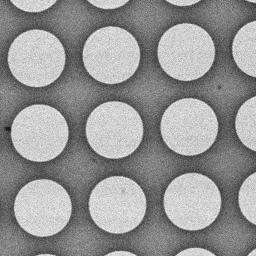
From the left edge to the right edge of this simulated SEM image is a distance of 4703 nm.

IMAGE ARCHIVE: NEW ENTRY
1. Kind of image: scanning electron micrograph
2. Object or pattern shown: an array of small figures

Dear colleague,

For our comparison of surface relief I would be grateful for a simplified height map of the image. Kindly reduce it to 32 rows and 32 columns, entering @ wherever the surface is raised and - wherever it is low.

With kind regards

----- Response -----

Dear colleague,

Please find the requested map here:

--@@@@@-----@@@-------@@--------
--------------------------------
--------------------------------
-------------@@------@@@@-----@@
--@@@@@----@@@@@@---@@@@@@---@@@
--@@@@@@---@@@@@@---@@@@@@@--@@@
-@@@@@@@--@@@@@@@---@@@@@@@--@@@
-@@@@@@@--@@@@@@@---@@@@@@@--@@@
-@@@@@@@---@@@@@@---@@@@@@----@@
--@@@@@-----@@@@-----@@@@-------
---@@@--------------------------
--------------------------------
-----------------------@@------@
---@@@@-----@@@@@----@@@@@----@@
--@@@@@@---@@@@@@---@@@@@@@---@@
--@@@@@@---@@@@@@@--@@@@@@@--@@@
-@@@@@@@---@@@@@@@--@@@@@@@---@@
--@@@@@@---@@@@@@@---@@@@@@---@@
--@@@@@@----@@@@@----@@@@@-----@
---@@@@------@@@----------------
--------------------------------
--------------------------------
-----@-------@@@------@@@@-----@
---@@@@@----@@@@@@---@@@@@@---@@
--@@@@@@@--@@@@@@@---@@@@@@@--@@
--@@@@@@@--@@@@@@@---@@@@@@@--@@
--@@@@@@@--@@@@@@@---@@@@@@---@@
--@@@@@@@---@@@@@@---@@@@@@----@
---@@@@@-----@@@@------@@-------
-----@--------------------------
--------------------------------
--------------@@-------@@@-----@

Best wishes